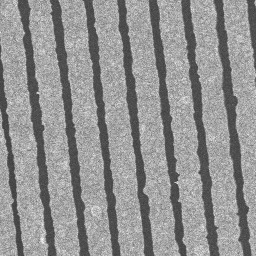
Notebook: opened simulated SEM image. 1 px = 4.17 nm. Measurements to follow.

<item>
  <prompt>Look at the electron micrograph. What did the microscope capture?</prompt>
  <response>parallel lines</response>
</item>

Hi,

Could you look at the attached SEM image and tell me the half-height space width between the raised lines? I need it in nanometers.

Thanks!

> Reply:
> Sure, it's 34.6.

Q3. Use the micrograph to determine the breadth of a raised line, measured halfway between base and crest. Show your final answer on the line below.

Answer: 24.1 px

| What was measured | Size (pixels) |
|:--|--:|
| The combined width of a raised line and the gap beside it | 32.3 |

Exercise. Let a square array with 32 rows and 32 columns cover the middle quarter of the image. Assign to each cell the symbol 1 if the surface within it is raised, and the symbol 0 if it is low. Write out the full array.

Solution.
01111110011111100111111000111110
01111110011111100111111000111110
01111110011111100111111100111110
01111110011111100011111101111110
01111110011111100011111101111111
00111110001111110011111100111111
00111110001111110011111100111111
00111111001111110011111100111111
00111111001111110011111100111111
00111111001111110011111100111111
00111111001111110011111100011111
00111111001111110011111100011111
00111111001111110011111100011111
00111111001111111011111100011111
00111111001111110001111110011111
00011111000111111001111110011111
00011111100111111001111110011111
00011111100111111001111110011111
10011111100111111001111110011111
10011111100111111001111110011111
10011111100111111001111110011111
10011111100111111001111110001111
10001111100111111101111110001111
10011111110111111100111111001111
10001111110011111100111111001111
10001111110011111100111111001111
10001111110011111100111111001111
11001111110011111100111111000111
11001111110011111100011111000111
11001111110011111100111111001111
11001111110011111100111111100111
11001111110011111100111111100111